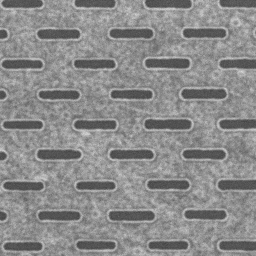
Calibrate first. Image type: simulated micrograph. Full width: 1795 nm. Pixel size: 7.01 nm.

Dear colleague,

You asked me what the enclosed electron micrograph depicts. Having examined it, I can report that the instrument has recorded a regular array of holes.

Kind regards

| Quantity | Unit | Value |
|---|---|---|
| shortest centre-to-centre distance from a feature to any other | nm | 328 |